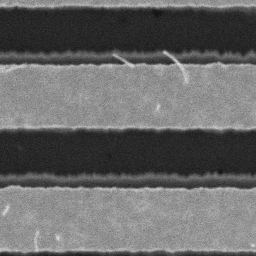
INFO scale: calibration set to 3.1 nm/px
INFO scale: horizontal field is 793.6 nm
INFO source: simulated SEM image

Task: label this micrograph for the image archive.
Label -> lines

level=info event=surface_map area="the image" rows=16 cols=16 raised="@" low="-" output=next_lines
----------------
----------------
----------------
@@@@@@@@@@@@@@@@
@@@@@@@@@@@@@@@@
@@@@@@@@@@@@@@@@
@@@@@@@@@@@@@@@@
@@@@@@@@@@@@@@@@
----------------
----------------
----------------
@@@@@@@@@@@@@@@@
@@@@@@@@@@@@@@@@
@@@@@@@@@@@@@@@@
@@@@@@@@@@@@@@@@
@@@@@@@@@@@@@@@@